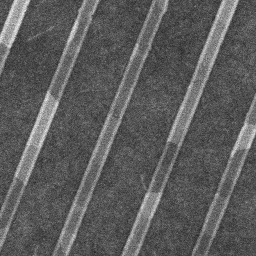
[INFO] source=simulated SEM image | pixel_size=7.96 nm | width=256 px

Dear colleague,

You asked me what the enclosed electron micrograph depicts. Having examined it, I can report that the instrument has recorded one or a few lines or trenches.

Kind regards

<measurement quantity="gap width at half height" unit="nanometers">418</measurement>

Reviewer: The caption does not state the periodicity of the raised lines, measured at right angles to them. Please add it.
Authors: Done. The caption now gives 515 nm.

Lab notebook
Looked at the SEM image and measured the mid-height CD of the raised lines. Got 94.4 nm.